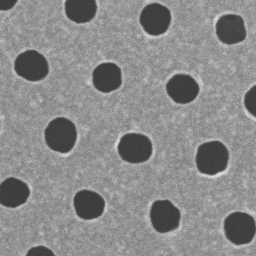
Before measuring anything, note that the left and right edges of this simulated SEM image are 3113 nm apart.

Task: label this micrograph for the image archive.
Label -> a regular array of holes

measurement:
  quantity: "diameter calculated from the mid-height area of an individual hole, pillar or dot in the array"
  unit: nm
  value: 389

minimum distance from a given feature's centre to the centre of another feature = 905 nm